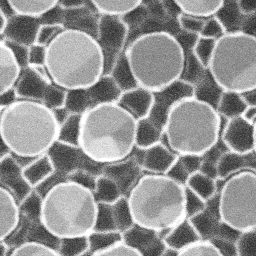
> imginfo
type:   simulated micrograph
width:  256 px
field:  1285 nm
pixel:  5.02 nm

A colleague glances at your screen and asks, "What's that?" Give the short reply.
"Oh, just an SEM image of raised bodies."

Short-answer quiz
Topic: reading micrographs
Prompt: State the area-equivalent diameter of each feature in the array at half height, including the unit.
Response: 280 nm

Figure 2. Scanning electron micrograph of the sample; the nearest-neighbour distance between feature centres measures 0.404 um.